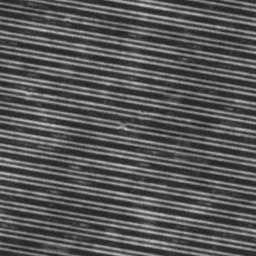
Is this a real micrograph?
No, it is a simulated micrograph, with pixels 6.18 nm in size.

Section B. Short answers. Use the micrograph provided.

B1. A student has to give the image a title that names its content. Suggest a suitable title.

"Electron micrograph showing parallel lines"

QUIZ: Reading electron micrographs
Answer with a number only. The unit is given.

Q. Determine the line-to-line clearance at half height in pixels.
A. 7.64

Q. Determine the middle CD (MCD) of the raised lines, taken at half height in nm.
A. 35.8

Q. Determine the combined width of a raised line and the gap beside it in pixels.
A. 13.9